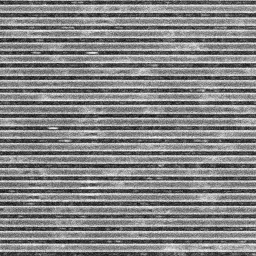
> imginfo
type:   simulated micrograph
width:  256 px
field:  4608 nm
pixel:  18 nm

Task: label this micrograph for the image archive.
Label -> parallel lines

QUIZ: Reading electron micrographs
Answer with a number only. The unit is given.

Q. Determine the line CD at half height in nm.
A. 135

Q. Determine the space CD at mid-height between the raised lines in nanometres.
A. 85.5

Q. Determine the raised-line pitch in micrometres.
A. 0.226